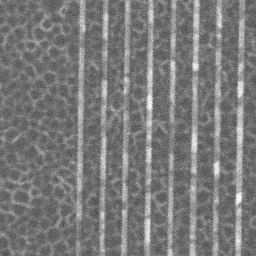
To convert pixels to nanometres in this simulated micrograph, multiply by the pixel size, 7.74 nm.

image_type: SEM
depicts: parallel lines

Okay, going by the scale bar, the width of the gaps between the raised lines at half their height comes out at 0.142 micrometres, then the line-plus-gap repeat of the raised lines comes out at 176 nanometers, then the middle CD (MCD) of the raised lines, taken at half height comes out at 30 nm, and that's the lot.